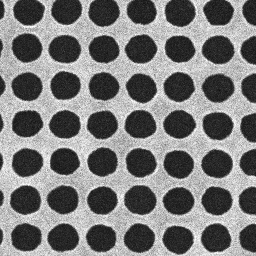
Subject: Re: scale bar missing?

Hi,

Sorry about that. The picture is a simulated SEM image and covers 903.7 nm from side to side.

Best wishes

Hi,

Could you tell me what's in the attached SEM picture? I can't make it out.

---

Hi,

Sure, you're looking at a regular array of holes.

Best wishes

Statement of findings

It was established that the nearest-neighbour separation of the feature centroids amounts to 0.131 micrometres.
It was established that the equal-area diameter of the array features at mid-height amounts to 0.105 micrometres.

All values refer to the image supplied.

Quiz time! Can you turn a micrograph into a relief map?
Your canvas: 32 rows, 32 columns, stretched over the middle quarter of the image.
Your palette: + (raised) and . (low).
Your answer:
++++++++++++++++++++++++++++++++
++++++++++++++++++++++++++++++++
...+++++....++++++..+++++++....+
....+++......++++.....++++......
....+++......+++.......++.......
....++........+........++.......
....++........++.......++.......
...++++......+++.......++.......
..+++++.....+++++.....++++.....+
++++++++++++++++++...+++++++..++
++++++++++++++++++++++++++++++++
.+++++++++.+++++++++++++++++..++
...++++.....+++++.....++++......
....++.......+++......+++.......
....++.......++........++.......
....++........+........++.......
....++.......++........++.......
...++++.....++++......++++......
..++++++...+++++++...+++++++..++
++++++++++++++++++++++++++++++++
++++++++++++++++++++++++++++++++
..++++++....+++++....+++++++.+++
...++++......+++......++++.....+
....++.......++........++.......
....++........+........++.......
....++.......+++.......++.......
...+++.......+++.......++.......
..++++++....+++++.....++++.....+
++++++++++++++++++++++++++++..++
++++++++++++++++++++++++++++++++
+++++++++++++++++....+++++++++++
...++++.....++++......++++.....+